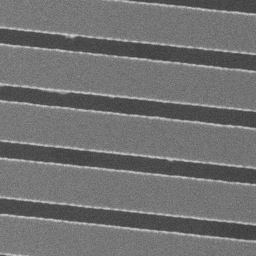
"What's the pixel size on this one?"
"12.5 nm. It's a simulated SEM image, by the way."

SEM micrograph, lines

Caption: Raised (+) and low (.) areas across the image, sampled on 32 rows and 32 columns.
++++++++++++++++++++............
+++++++++++++++++++++++++++++...
++++++++++++++++++++++++++++++++
.+++++++++++++++++++++++++++++++
..........++++++++++++++++++++++
+...................++++++++++++
+++++++++....................+++
+++++++++++++++++++.............
++++++++++++++++++++++++++++....
++++++++++++++++++++++++++++++++
++++++++++++++++++++++++++++++++
.........+++++++++++++++++++++++
..................++++++++++++++
+++++++++...................++++
++++++++++++++++++..............
+++++++++++++++++++++++++++.....
++++++++++++++++++++++++++++++++
++++++++++++++++++++++++++++++++
........++++++++++++++++++++++++
.................+++++++++++++++
+++++++....................+++++
+++++++++++++++++...............
+++++++++++++++++++++++++++.....
++++++++++++++++++++++++++++++++
++++++++++++++++++++++++++++++++
.......+++++++++++++++++++++++++
.................+++++++++++++++
+++++++...................++++++
+++++++++++++++++...............
+++++++++++++++++++++++++.......
++++++++++++++++++++++++++++++++
++++++++++++++++++++++++++++++++